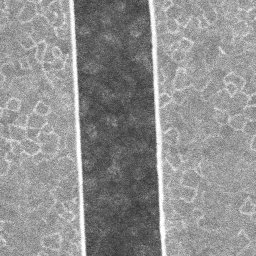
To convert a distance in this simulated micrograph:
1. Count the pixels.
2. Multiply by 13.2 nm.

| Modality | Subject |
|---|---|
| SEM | one or a few lines or trenches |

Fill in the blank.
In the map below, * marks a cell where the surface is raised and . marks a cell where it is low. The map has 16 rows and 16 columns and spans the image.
****.....*******
*****.....******
*****.....******
*****.....******
*****.....******
*****.....******
*****.....******
*****.....******
*****.....******
*****.....******
*****.....******
*****.....******
*****.....******
*****.....******
*****.....******
*****.....******